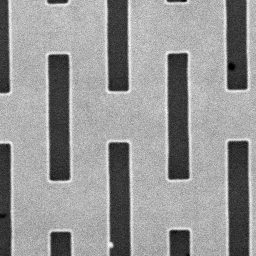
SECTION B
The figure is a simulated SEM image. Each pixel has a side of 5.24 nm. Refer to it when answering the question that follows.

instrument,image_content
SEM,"groups of lines, slits or small figures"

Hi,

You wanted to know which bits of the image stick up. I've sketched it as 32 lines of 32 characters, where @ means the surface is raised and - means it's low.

-@@@@@--@@@@@---@@@@@@@@@@@@---@
-@@@@@@@@@@@@---@@@@@@@@@@@@---@
-@@@@@@@@@@@@---@@@@@@@@@@@@---@
-@@@@@@@@@@@@---@@@@@@@@@@@@---@
-@@@@@@@@@@@@---@@@@@@@@@@@@---@
-@@@@@@@@@@@@---@@@@@@@@@@@@---@
-@@@@@@@@@@@@---@@@@@@@@@@@@---@
-@@@@@---@@@@---@@@@@---@@@@---@
-@@@@@---@@@@---@@@@@---@@@@---@
-@@@@@---@@@@---@@@@@---@@@@---@
-@@@@@---@@@@---@@@@@---@@@@---@
-@@@@@---@@@@@--@@@@@---@@@@@@@@
@@@@@@---@@@@@@@@@@@@---@@@@@@@@
@@@@@@---@@@@@@@@@@@@---@@@@@@@@
@@@@@@---@@@@@@@@@@@@---@@@@@@@@
@@@@@@---@@@@@@@@@@@@---@@@@@@@@
@@@@@@---@@@@@@@@@@@@---@@@@@@@@
@@@@@@---@@@@@@@@@@@@---@@@@@@@@
-@@@@@---@@@@---@@@@@---@@@@---@
--@@@@---@@@@---@@@@@---@@@@---@
--@@@@---@@@@---@@@@@---@@@@---@
--@@@@---@@@@@--@@@@@---@@@@---@
--@@@@---@@@@@--@@@@@--@@@@@---@
--@@@@@@@@@@@@--@@@@@@@@@@@@---@
--@@@@@@@@@@@@--@@@@@@@@@@@@---@
--@@@@@@@@@@@@--@@@@@@@@@@@@---@
--@@@@@@@@@@@@--@@@@@@@@@@@@---@
--@@@@@@@@@@@@--@@@@@@@@@@@@---@
--@@@@@@@@@@@@--@@@@@@@@@@@@---@
--@@@@---@@@@@--@@@@@---@@@@---@
--@@@@---@@@@@--@@@@@---@@@@---@
--@@@@---@@@@@--@@@@@---@@@@---@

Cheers